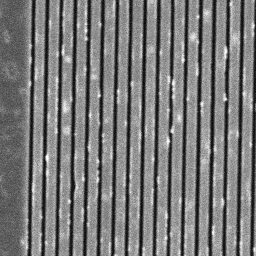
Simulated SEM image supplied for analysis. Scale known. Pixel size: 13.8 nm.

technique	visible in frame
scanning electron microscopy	parallel lines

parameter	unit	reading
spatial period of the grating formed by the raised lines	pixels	13.9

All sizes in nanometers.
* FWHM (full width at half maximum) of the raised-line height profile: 129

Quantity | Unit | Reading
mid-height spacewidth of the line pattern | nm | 58.6